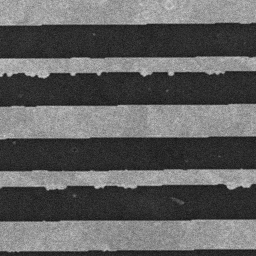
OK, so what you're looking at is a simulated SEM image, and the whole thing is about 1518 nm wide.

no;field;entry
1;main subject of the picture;lines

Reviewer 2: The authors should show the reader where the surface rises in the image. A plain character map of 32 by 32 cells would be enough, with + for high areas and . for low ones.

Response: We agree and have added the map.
++++++++++++++++++++++++++++++++
++++++++++++++++++++++++++++++++
++++++++++++++++++++++++++++++++
................................
................................
................................
................................
++++++++++++++++++++++++++++++++
++++++++++++++++++++++++++++++++
.....+..........................
................................
................................
................................
++++++++++++++++++++++++++++++++
++++++++++++++++++++++++++++++++
++++++++++++++++++++++++++++++++
++++++++++++++++++++++++++++++++
................................
................................
................................
................................
++++++++++++++++++++++++++++++++
++++++++++++++++++++++++++++++++
......++........................
................................
................................
................................
................................
++++++++++++++++++++++++++++++++
++++++++++++++++++++++++++++++++
++++++++++++++++++++++++++++++++
................................